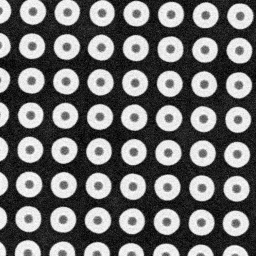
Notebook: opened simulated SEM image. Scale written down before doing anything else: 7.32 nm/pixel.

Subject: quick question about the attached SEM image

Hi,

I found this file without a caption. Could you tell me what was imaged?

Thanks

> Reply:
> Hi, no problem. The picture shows an array of small figures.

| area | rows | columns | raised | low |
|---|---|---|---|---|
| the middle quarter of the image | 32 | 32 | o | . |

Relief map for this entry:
................................
oo......oo......................
ooo....ooooo...ooooo....oooo....
oooo..oooooo...oooooo...ooooo...
oooo..oooooo...oooooo..ooooooo..
ooo...oooooo...oooooo..ooooooo..
ooo....ooooo...ooooo....ooooo...
o.......oo......ooo......ooo....
................................
................................
oo......ooo.....ooo......oo.....
ooo...oooooo...ooooo....ooooo...
ooo...oooooo...oooooo..oooooo...
ooo...oooooo..ooooooo..oooooo...
ooo...oooooo...oooooo..oooooo...
oo.....oooo....ooooo....ooooo...
.................oo......ooo....
................................
................................
ooo....oooo.....ooo......ooo....
ooo...oooooo...ooooo...oooooo...
ooo...oooooo..ooooooo..oooooo...
ooo...oooooo..ooooooo..oooooo...
ooo...ooooo....ooooo...oooooo...
o......ooo.....oooo.....oooo....
................................
................................
oo.....ooo......................
ooo...ooooo....ooooo....oooo....
ooo...oooooo..oooooo...oooooo...
ooo...oooooo..oooooo...oooooo..o
ooo...oooooo..oooooo...oooooo..o